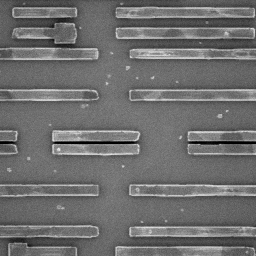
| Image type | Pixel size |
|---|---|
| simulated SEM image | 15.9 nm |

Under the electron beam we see wiring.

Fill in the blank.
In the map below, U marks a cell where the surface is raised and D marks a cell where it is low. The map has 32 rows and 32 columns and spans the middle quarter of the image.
DDDDDDDDDDDDDDDDDDDDDDDDDDDDDDDD
DDDDDDDDDDDDDDDDDDDDDDDDDDDDDDDD
DDDDDDDDDDDDDDDDDDDDDDDDDDDDDDDD
DDDDDDDDDDDDDDDDDDDDDDDDDDDDDDDD
DDDDDDDDDDDDDDDDDDDDDDDDDDDDDDDD
DDDDDDDDDDDDDDDDDDDDDDDDDDDDDDDD
DDDDDDDDDDDDDDDDDDDDDDDDDDDDDDDD
UUUUUUUUDDDDDDDDDUUUUUUUUUUUUUUU
UUUUUUUUDDDDDDDDDUUUUUUUUUUUUUUU
DDDDDDDDDDDDDDDDDDDDDDDDDDDDDDDD
DDDDDDDDDDDDDDDDDDDDDDDDDDDDDDDD
DDDDDDDDDDDDDDDDDDDDDDDDDDDDDDDD
DDDDDDDDDDDDDDDDDDDDDDDDDDDDDDDD
DDDDDDDDDDDDDDDDDDDDDDDDDDDDDDDD
DDDDDDDDDDDDDDDDDDDDDDDDDDDDDDDD
DDDDDDDDDDDDDDDDDDDDDDDDDDDDDDDD
DDDDDDDDDDDDDDDDDDDDDDDDDDDDDDDD
UUUUUUUUUUUUUUUUUUUDDDDDDDDDDDDU
UUUUUUUUUUUUUUUUUUUDDDDDDDDDDDDU
DDDDDDDDDDDDDDDDDDDDDDDDDDDDDDDD
UUUUUUUUUUUUUUUUUUUDDDDDDDDDDDDU
UUUUUUUUUUUUUUUUUUUDDDDDDDDDDDDU
DDDDDDDDDUUUDDDDDDDDDDDDDDDDDDDD
DDDDDDDDDDDDDDDDDDDDDDDDDDDDDDDD
DDDDDDDDDDDDDDDDDDDDDDDDDDDDDDDD
DDDDDDDDDDDDDDDDDDDDDDDDDDDDDDDD
DDDDDDDDDDDDDDDDDDDDDDDDDDDDDDDD
DDDDDDDDDDDDDDDDDDDDDDDDDDDDDDDD
DDDDDDDDDDDDDDDDDDDDDDDDDDDDDDDD
DDDDDDDDDDDDDDDDDDDDDDDDDDDDDDDD
UUUUUUUUDDDDDDDDDUUUUUUUUUUUUUUU
UUUUUUUUDDDDDDDDDUUUUUUUUUUUUUUU